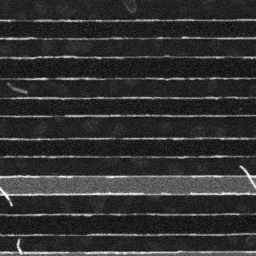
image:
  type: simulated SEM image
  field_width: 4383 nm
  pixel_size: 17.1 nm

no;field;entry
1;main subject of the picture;parallel lines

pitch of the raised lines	669	nanometers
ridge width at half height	319	nm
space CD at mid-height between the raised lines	319	nm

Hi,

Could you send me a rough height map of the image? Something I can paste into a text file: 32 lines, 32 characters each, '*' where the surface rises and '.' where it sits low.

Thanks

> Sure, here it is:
................*...............
................................
.............................*..
********************************
********************************
................................
................................
********************************
********************************
********************************
................................
................................
********************************
********************************
**********...........***........
................................
................................
********************************
********************************
********************************
................................
................................
********************************
********************************
................................
................................
................................
********************************
********************************
................................
................................
..*...................*........*